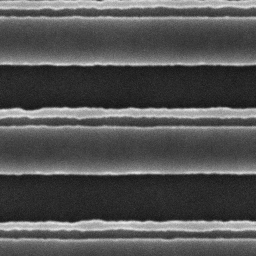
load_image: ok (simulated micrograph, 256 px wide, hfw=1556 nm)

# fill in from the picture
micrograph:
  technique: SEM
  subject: lines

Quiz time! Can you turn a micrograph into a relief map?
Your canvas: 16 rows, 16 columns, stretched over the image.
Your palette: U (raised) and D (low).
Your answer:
UUUUUUUUUUUUUUUU
UUUUUUUUUUUUUUUU
UUUUUUUUUUUUUUUU
UUUUUUUUUUUUUUUU
DDDDDDDDDDDDDDDD
DDDDDDDDDDDDDDDD
DDDDDDDDDDDDDDDD
UUUUUUUUUUUUUUUU
UUUUUUUUUUUUUUUU
UUUUUUUUUUUUUUUU
UUUUUUUUUUUUUUUU
DDDDDDDDDDDDDDDD
DDDDDDDDDDDDDDDD
DDDDDDDDDDDDDDDD
UUUUUUUUUUUUUUUU
UUUUUUUUUUUUUUUU